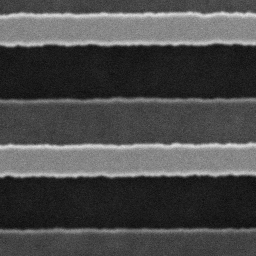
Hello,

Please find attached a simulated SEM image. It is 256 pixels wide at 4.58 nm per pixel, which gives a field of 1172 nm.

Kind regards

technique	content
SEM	lines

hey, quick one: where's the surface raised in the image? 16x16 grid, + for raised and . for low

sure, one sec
++++++++++++++++
++++++++++++++++
++++++++++++++++
................
................
................
++++++++++++++++
++++++++++++++++
++++++++++++++++
++++++++++++++++
++++++++++++++++
................
................
................
++++++++++++++++
++++++++++++++++